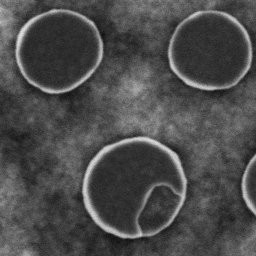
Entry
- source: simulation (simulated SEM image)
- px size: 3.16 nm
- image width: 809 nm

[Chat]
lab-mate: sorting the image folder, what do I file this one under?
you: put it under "raised bodies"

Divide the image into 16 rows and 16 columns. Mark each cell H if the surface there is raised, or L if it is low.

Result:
LLLLLLLLLLLLLLLL
LLHHHHLLLLLHHHHL
LHHHHHLLLLLHHHHH
LHHHHHLLLLLHHHHH
LHHHHHLLLLLHHHHL
LLLHHLLLLLLLLHLL
LLLLLLLLLLLLLLLL
LLLLLLLLLLLLLLLL
LLLLLLLLLLLLLLLL
LLLLLLHHHHHLLLLL
LLLLLLHHHHHLLLLH
LLLLLHHHHHHHLLLH
LLLLLHHHHLLLLLLH
LLLLLLHHHLLLLLLL
LLLLLLLHHLLLLLLL
LLLLLLLLLLLLLLLL